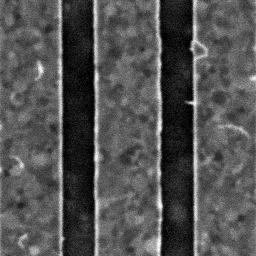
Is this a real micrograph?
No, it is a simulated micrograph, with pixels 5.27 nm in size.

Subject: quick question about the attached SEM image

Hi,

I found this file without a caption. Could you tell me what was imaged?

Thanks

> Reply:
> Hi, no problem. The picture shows one or a few lines or trenches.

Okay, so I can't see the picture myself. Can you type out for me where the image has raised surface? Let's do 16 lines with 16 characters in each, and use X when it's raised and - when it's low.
XXXX--XXXX--XXXX
XXXX--XXXX--XXXX
XXXX--XXXX--XXXX
XXXX--XXXX--XXXX
XXXX--XXXX--XXXX
XXXX--XXXX--XXXX
XXXX--XXXX--XXXX
XXXX--XXXX--XXXX
XXXX--XXXX--XXXX
XXXX--XXXX--XXXX
XXXX--XXXX--XXXX
XXXX--XXXX--XXXX
XXXX--XXXX--XXXX
XXXX--XXXX--XXXX
XXXX--XXXX--XXXX
XXXX--XXXX--XXXX